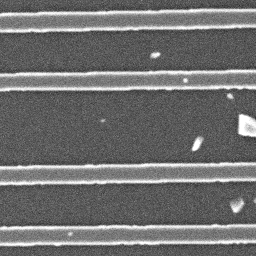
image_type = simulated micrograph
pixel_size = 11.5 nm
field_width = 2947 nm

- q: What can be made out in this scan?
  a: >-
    lines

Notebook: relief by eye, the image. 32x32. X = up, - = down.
--------------------------------
-------------XXXXXXXXXXXXXXXXXXX
XXXXXXXXXXXXXXXXXXXXXXXXXXXXXXXX
XXXXXXXXXXXXXXXXXXXXXXXXXX------
--------------------------------
--------------------------------
--------------------------------
--------------------------------
--------------------------------
XXXXXXXXXXXXXXXXXXXXXXXXXXXXXXXX
XXXXXXXXXXXXXXXXXXXXXXXXXXXXXXXX
--------------------------------
--------------------------------
--------------------------------
------------------------------X-
------------------------------XX
------------------------------XX
--------------------------------
--------------------------------
--------------------------------
---------------------------XXXXX
XXXXXXXXXXXXXXXXXXXXXXXXXXXXXXXX
XXXXXXXXXXXXXXXXXXXXXXXXXXXXXXXX
--------------------------------
--------------------------------
--------------------------------
--------------------------------
--------------------------------
XXXXXXXXXXXXXXXXXXXXXXXXXXXXXXXX
XXXXXXXXXXXXXXXXXXXXXXXXXXXXXXXX
XXXXX-XX------------------------
--------------------------------